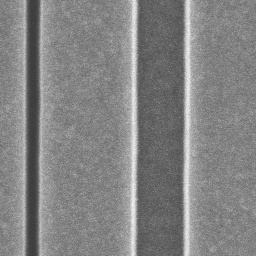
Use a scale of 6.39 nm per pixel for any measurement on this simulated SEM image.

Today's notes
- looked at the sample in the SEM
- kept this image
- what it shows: one or a few lines or trenches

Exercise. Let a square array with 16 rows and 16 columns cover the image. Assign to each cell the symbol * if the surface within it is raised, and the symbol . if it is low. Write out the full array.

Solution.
**.*****....****
********....****
********....****
********....****
********....****
********....****
********....****
********....****
********....****
********....****
********....****
********....****
********....****
********....****
********....****
********....****